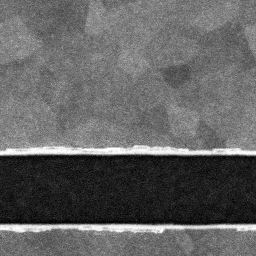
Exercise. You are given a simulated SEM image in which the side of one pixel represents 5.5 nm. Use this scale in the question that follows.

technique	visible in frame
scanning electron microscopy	one or a few lines or trenches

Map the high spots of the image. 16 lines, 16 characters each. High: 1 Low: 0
1111111111111111
1111111111111111
1111111111111111
1111111111111111
1111111111111111
1111111111111111
1111111111111111
1111111111111111
1111111111111111
1111111111111111
0000000000000000
0000000000000000
0000000000000000
0000000000000000
1111111111111111
1111111111111111